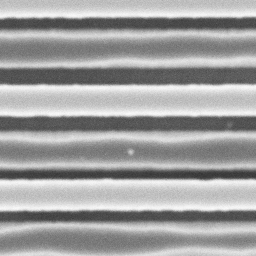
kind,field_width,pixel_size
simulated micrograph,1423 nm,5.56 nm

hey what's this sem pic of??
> lines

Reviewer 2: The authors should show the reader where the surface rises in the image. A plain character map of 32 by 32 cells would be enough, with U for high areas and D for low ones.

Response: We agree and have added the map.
UUUUUUUUUUUUUUUUUUUUUUUUUUUUUUUU
UUUUUUUUUUUUUUUUUUUUUUUUUUUUUUUU
DDDDDDDDDDDDDDDDDDDDDDDDDDDDDDDD
DDDDDDDDDDDDDDDDDDDDDDDDDDDDDDDD
UUUUUUUUUUUUUUUUUUUUUUUUUUUUUUUU
UUUUUUUUUUUUUUUUUUUUUUUUUUUUUUUU
UUUUUUUUUUUUUUUUUUUUUUUUUUUUUUUU
UUUUUUUUUUUUUUUUUUUUUUUUUUUUUUUU
DDDDDDDDDDDDDDDDDDDDDDDDDDDDDDDD
DDDDDDDDDDDDDDDDDDDDDDDDDDDDDDDD
DDDDDDDDDDDDDDDDDDDDDDDDDDDDDDDD
UUUUUUUUUUUUUUUUUUUUUUUUUUUUUUUU
UUUUUUUUUUUUUUUUUUUUUUUUUUUUUUUU
UUUUUUUUUUUUUUUUUUUUUUUUUUUUUUUU
DDDDDDDDDDDDDDDDDDDDDDDDDDDDDDDD
DDDDDDDDDDDDDDDDDDDDDDDDDDDDDDDD
DDDDDDDDDDDDDDDDDDDDDDDDDDDDDDDD
UUUUUUUUUUUUUUUUUUUUUUUUUUUUUUUU
UUUUUUUUUUUUUUUUUUUUUUUUUUUUUUUU
UUUUUUUUUUUUUUUUUUUUUUUUUUUUUUUU
UUUUUUUUUUUUUUUUUUUUUUUUUUUUUUUU
DDDDDDDDDDDDDDDDDDDDDDDDDDDDDDDD
DDDDDDDDDDDDUUDDDDDDDDDDDDDUDDDU
UUUUUUUUUUUUUUUUUUUUUUUUUUUUUUUU
UUUUUUUUUUUUUUUUUUUUUUUUUUUUUUUU
UUUUUUUUUUUUUUUUUUUUUUUUUUUUUUUU
DDDDDDDDDDDDDDDDDDDDDDDDDDDDDDDD
DDDDDDDDDDDDDDDDDDDDDDDDDDDDDDDD
UUUUUUUUUUUUUUUUUUUUUUUUUUUUUUUU
UUUUUUUUUUUUUUUUUUUUUUUUUUUUUUUU
UUUUUUUUUUUUUUUUUUUUUUUUUUUUUUUU
UUUUUUUUUUUUUUUUUUUUUUUUUUUUUUUU